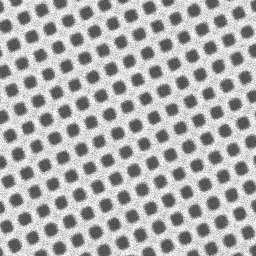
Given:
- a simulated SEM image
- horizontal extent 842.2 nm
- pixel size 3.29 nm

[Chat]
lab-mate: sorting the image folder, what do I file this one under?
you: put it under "a regular array of holes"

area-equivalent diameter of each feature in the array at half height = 45.6 nm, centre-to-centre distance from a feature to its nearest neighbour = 64.9 nanometers